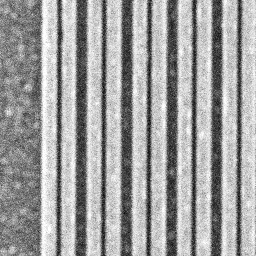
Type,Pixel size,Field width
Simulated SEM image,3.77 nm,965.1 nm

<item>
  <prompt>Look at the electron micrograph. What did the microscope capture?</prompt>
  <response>parallel lines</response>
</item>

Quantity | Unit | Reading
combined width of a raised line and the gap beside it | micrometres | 0.0846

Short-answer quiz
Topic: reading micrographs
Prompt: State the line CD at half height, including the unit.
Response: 52.4 nm